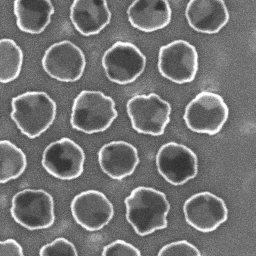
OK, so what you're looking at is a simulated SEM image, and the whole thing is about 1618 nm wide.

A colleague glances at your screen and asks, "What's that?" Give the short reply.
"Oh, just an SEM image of a regular array of raised bodies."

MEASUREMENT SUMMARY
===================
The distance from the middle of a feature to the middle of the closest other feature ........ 346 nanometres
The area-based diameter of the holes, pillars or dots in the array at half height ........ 254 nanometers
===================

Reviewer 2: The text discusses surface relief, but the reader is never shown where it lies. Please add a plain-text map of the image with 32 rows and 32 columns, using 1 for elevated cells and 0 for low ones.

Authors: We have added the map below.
00111100011110000111100011110000
00111110011111001111100111110000
00111100011111001111100011110000
00011000001110000111000011110000
00000000000000000000000000000000
11000001100000010000011000000000
11100011110001111000111100000000
11100111111001111100111110000000
11000011110001111100111100000000
11000011110001111000011100000000
00000000000000000000000000000000
00000000000100000000000000000000
00111100011111001111000011110000
00111110011111001111100111110000
00111110011111001111100111110000
00111100011111000111100111110000
00011000000100000011000000100000
00000000100000000000000000000000
11000011110001111000111000000000
11100111110011111000111100000000
11100111110001111000111100000000
11100011110001110000111100000000
10000000000000000000011000000000
00000000000000000000000000000000
00111100001110001111100011100000
00111110011111001111100111110000
00111110011111001111100111110000
00111110001111001111100111110000
00001000000110000111000001100000
00000000000000000000000000000000
11000011100000110000011000000000
11100111100001111000111110000000